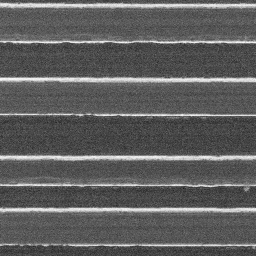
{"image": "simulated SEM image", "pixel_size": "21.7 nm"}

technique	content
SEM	lines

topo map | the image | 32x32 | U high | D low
DDDDDDDDDDDDDDDDDDDDDDDDDDDDDDDD
UUUUUUUUUUUUUUUUUUUUUUUUUUUUUUUU
UUUUUUUUUUUUUUUUUUUUUUUUUUUUUUUU
UUUUUUUUUUUUUUUUUUUUUUUUUUUUUUUU
UUUUUUUUUUUUUUUUUUUUUUUUUUUUUUUU
DDDDDDDDDDDDDDDDDDDDDDDDDDDDDDDD
DDDDDDDDDDDDDDDDDDDDDDDDDDDDDDDD
DDDDDDDDDDDDDDDDDDDDDDDDDDDDDDDD
DDDDDDDDDDDDDDDDDDDDDDDDDDDDDDDD
DDDDDDDDDDDDDDDDDDDDDDDDDDDDDDDD
UUUUUUUUUUUUUUUUUUUUUUUUUUUUUUUU
UUUUUUUUUUUUUUUUUUUUUUUUUUUUUUUU
UUUUUUUUUUUUUUUUUUUUUUUUUUUUUUUU
UUUUUUUUUUUUUUUUUUUUUUUUUUUUUUUU
DDDDDDDDDDDDDDDDDDDDDDDDDDDDDDDD
DDDDDDDDDDDDDDDDDDDDDDDDDDDDDDDD
DDDDDDDDDDDDDDDDDDDDDDDDDDDDDDDD
DDDDDDDDDDDDDDDDDDDDDDDDDDDDDDDD
DDDDDDDDDDDDDDDDDDDDDDDDDDDDDDDD
DDDDDDDDDDDDDDDDDDDDDDDDDDDDDDDD
UUUUUUUUUUUUUUUUUUUUUUUUUUUUUUUU
UUUUUUUUUUUUUUUUUUUUUUUUUUUUUUUU
UUUUUUUUUUUUUUUUUUUUUUUUUUUUUUUU
DDDDDDDDDDDDDDDDDDDDDDDDDDDDDDDD
DDDDDDDDDDDDDDDDDDDDDDDDDDDDDDDD
DDDDDDDDDDDDDDDDDDDDDDDDDDDDDDDD
UUUUUUUUUUUUUUUUUUUUUUUUUUUUUUUU
UUUUUUUUUUUUUUUUUUUUUUUUUUUUUUUU
UUUUUUUUUUUUUUUUUUUUUUUUUUUUUUUU
UUUUUUUUUUUUUUUUUUUUUUUUUUUUUUUU
UUUUUUUUUUUUUUUUUUUUUUUUUUUUUUUU
DDDDDDDDDDDDDDDDDDDDDDDDDDDDDDDD